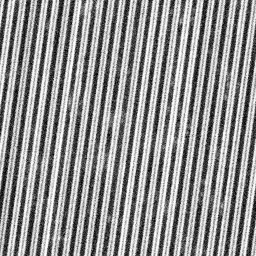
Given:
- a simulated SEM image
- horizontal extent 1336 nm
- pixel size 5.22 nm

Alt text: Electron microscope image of parallel lines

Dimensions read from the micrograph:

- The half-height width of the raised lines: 23.2 nm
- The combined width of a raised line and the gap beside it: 11 pixels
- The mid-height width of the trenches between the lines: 32.3 nm